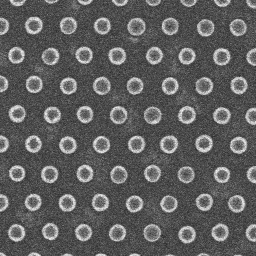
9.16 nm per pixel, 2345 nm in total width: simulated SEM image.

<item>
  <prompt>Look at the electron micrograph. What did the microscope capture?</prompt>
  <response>a regular array of raised bodies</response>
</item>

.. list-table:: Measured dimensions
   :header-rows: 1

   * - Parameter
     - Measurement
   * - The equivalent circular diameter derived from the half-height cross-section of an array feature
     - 149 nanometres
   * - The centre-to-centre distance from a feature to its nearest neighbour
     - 303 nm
